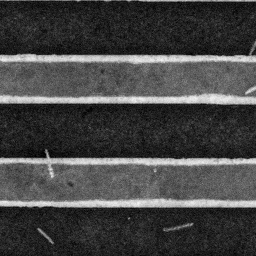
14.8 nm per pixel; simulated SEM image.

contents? lines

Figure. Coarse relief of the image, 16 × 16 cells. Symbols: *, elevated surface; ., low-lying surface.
................
................
................
................
****************
****************
................
................
................
................
****************
****************
****************
................
................
................